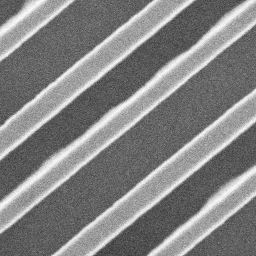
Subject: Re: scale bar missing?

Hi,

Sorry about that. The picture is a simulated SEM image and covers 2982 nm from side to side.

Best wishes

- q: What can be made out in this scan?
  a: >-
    lines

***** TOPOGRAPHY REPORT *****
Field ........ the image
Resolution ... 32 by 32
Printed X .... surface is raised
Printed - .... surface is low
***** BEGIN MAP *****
----XXXXX----------XXXX--------X
---XXXX-----------XXXX--------XX
--XXXX----------XXXXX-------XXXX
-XXXX----------XXXXX-------XXXX-
XXXX----------XXXXX-------XXXX--
XX-----------XXXX--------XXXX---
X----------XXXXX--------XXX-----
----------XXXXX-------XXXX------
---------XXXXX-------XXXX-------
--------XXXX--------XXXX--------
-------XXXX--------XXXX---------
-----XXXXX--------XXXX----------
----XXXXX-------XXXX----------XX
---XXXXX-------XXXX----------XXX
--XXXX--------XXXX----------XXXX
-XXXX--------XXXX----------XXXX-
XXXX-------XXXX----------XXXXX--
XXX-------XXXX----------XXXXX---
XX-------XXXX----------XXXXX----
--------XXXX----------XXXX------
------XXXX----------XXXXX-------
-----XXXX----------XXXXX-------X
----XXXX----------XXXXX-------XX
---XXXX----------XXXXX-------XXX
--XXXX----------XXXX--------XXXX
XXXX----------XXXXX-------XXXXX-
XXX----------XXXXX-------XXXX---
XX----------XXXXX-------XXXX----
X----------XXXX--------XXXX-----
----------XXXX--------XXXX------
--------XXXXX-------XXXX--------
-------XXXXX-------XXXX---------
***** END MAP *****